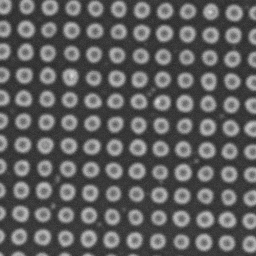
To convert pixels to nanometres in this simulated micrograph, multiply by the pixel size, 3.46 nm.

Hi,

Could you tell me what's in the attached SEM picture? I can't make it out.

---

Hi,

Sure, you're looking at an array of small figures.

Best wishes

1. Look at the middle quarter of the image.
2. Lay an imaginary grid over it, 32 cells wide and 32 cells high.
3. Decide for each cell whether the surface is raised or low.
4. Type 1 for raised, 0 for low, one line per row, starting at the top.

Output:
00000000000000000000000000000000
01100000000000000000000000000000
11100011100011100011000111000010
11100011100111100111100111100111
11100011100111100111100111000111
00000000000011000011000011000111
00000000000000000000000000000000
11100001000000000000000000000000
11100111100111100111000111000111
11100111100111100111100111101111
01100011100111000111100111001111
00000000000000000000000000000111
00000000000000000000000000000000
11100011100011000010000000000000
11100111100111100111000111000111
11100111100111100111000111001111
00000011000111000111000111000111
00000000000000000000000000000000
00000000000000000000000000000000
11100011100111000111000110000100
11100111100111100111101111001110
11100111100111000111001111001111
00000011000011000111000111001111
00000000000000000000000000000000
11000000000000000000000000000000
11100111000111000111000000000110
11100111100111001111001111001111
11000111000111001111001111001111
00000000000011000110000110001110
00000000000000000000000000000000
11000010000000000000000000000000
11100111000111000110001110001110